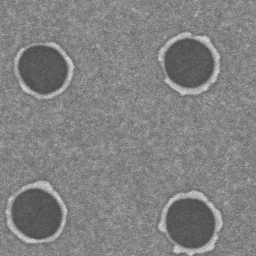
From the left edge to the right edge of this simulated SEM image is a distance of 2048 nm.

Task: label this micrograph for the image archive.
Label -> holes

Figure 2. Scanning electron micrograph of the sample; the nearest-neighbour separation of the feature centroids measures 1160 nanometres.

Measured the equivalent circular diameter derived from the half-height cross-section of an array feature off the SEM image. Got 0.41 micrometres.